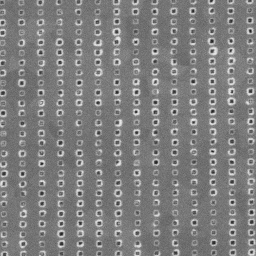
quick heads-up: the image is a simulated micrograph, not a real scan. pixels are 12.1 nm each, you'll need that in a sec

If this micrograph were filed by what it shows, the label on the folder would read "a regular array of holes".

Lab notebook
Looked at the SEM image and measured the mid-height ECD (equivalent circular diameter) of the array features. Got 54.5 nanometers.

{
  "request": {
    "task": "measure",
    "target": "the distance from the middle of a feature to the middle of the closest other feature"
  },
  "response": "120 nm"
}